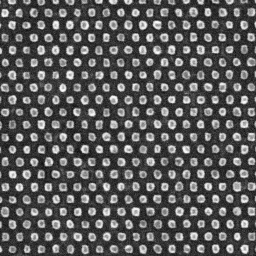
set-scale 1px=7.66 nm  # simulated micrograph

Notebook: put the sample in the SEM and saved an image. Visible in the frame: a regular array of raised bodies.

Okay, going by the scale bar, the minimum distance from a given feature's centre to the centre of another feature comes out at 108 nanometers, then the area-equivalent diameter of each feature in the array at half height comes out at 53.3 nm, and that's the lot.